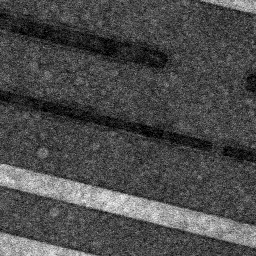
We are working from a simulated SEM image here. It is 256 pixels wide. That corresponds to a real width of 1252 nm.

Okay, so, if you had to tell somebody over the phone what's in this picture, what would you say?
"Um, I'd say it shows one or a few lines or trenches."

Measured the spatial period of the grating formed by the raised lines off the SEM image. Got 0.367 µm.